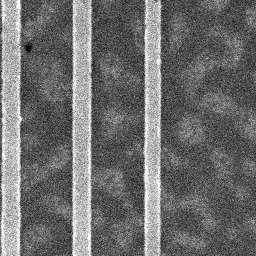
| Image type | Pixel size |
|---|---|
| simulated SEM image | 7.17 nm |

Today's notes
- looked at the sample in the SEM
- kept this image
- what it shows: one or a few lines or trenches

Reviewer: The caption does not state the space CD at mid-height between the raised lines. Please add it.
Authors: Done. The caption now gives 391 nm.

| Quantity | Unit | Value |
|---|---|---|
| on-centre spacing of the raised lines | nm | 508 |